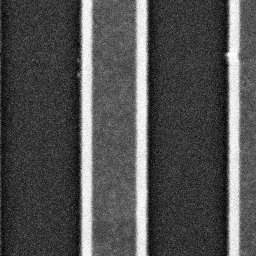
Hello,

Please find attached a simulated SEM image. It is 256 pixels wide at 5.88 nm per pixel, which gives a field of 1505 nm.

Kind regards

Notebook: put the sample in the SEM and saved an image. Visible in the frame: one or a few lines or trenches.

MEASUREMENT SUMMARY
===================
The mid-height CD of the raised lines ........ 327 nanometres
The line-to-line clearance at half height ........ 541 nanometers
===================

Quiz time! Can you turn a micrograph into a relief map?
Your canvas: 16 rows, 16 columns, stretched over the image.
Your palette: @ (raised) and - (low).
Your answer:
-----@@@@------@
-----@@@@------@
-----@@@@------@
-----@@@@------@
-----@@@@------@
-----@@@@------@
-----@@@@------@
-----@@@@------@
-----@@@@------@
-----@@@@------@
-----@@@@------@
-----@@@@------@
-----@@@@------@
-----@@@@------@
-----@@@@------@
-----@@@@------@